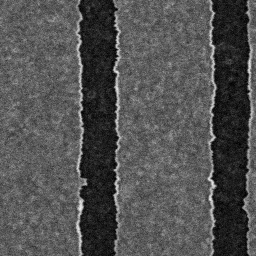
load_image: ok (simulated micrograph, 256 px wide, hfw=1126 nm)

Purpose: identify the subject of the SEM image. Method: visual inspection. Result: one or a few lines or trenches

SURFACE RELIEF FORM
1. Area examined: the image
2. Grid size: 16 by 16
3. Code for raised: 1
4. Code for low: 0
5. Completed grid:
1111100111111001
1111100111111000
1111100111111000
1111100111111000
1111100111111000
1111100111111000
1111100111111000
1111100111111000
1111100111111000
1111100111111000
1111100111111000
1111100111111001
1111100111111001
1111100111111001
1111100111111000
1111100111111001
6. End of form